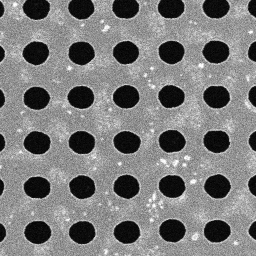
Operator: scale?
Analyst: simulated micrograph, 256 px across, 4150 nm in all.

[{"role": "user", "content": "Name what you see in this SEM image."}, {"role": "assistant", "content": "a regular array of holes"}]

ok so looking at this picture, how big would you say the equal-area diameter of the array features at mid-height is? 0.406 micrometres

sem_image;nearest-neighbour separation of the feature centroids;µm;0.721